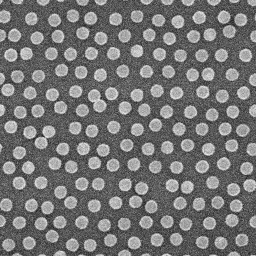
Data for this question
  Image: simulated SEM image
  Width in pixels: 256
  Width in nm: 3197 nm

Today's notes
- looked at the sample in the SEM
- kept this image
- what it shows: a regular array of raised bodies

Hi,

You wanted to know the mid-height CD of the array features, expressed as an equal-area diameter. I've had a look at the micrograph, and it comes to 12 pixels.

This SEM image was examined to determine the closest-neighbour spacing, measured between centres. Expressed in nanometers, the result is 224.